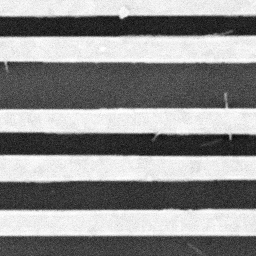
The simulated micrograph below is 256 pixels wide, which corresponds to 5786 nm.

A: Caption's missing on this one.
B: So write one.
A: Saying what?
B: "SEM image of lines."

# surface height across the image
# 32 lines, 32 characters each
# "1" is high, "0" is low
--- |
11111111111111111111111111111111
11111111111111111111111111111111
00000000000000000000000000000000
00000000000000000000000000000000
00000000000000000000000000000000
11111111111111111111111111111111
11111111111111111111111111111111
11111111111111111111111111111111
00000000000000000000000000000000
00000000000000000000000000000000
00000000000000000000000000000000
00000000000000000000000000000000
00000000000000000000000000000000
00000000000000000000000000000000
11111111111111111111111111111111
11111111111111111111111111111111
00000000000000000001111111111111
00000000000000000000000000000000
00000000000000000000000000000000
11110010000000000000000000000000
11111111111111111111111111111111
11111111111111111111111111111111
11111111000000000010000000000000
00000000000000000000000000000000
00000000000000000000000000000000
00000000000000000000000000000000
11111111111111111111111111111111
11111111111111111111111111111111
11111111111111111111111111111111
00000000000000000000000000000000
00000000000000000000000000000000
00000000000000000000000000000000